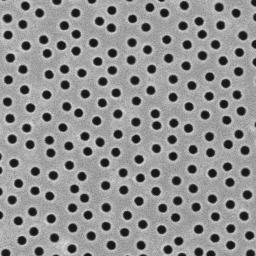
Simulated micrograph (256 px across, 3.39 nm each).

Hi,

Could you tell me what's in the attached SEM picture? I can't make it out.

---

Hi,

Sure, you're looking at a regular array of holes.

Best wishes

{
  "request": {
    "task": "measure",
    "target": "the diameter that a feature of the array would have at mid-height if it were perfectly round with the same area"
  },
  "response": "0.0292 um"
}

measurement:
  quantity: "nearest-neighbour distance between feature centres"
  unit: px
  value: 17